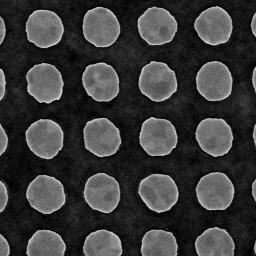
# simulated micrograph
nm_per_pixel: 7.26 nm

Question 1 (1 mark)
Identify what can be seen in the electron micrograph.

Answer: a regular array of raised bodies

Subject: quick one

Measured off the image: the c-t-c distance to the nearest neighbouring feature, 55.2 px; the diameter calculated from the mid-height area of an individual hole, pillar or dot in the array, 38 pixels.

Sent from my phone